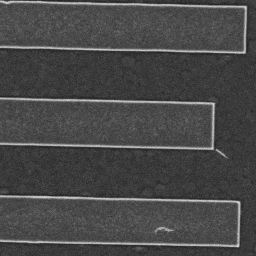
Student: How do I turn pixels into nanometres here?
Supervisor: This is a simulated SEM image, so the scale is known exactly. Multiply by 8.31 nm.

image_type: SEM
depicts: one or a few lines or trenches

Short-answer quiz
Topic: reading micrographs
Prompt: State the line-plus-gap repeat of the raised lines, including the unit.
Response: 0.808 µm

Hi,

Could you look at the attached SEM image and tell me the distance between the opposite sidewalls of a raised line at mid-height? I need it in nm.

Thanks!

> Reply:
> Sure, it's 381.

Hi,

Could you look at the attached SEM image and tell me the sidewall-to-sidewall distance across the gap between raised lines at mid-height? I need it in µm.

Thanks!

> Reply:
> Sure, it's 0.427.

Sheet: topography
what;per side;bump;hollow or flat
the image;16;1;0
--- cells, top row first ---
1111111111111110
1111111111111110
1111111111111110
0000000000000000
0000000000000000
0000000000000000
1111111111111000
1111111111111000
1111111111111000
0000000000000000
0000000000000000
0000000000000000
1111111110000000
1111111111111110
1111111111111110
0000000000000000